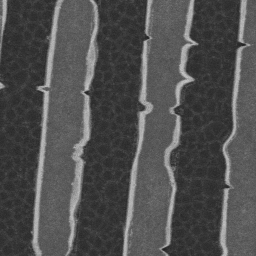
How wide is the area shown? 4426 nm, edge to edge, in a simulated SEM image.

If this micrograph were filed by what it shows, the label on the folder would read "one or a few lines or trenches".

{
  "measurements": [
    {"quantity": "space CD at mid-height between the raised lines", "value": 940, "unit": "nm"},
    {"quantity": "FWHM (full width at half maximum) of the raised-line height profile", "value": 39.3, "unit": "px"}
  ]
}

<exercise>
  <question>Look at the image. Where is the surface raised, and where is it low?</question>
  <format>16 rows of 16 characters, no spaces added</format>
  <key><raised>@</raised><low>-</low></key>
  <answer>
----@@---@@@---@
---@@@---@@@---@
---@@@---@@@---@
---@@@---@@----@
---@@@---@@@---@
---@@----@@----@
---@@----@@----@
---@@----@@----@
---@@----@@---@@
---@@----@@---@@
---@@---@@@---@@
--@@@---@@@---@@
--@@@---@@@---@@
--@@@---@@@---@@
--@@@---@@@---@@
--@@----@@----@@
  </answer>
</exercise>